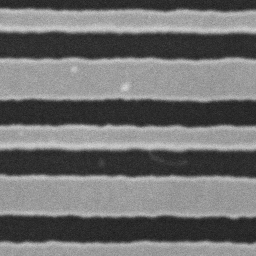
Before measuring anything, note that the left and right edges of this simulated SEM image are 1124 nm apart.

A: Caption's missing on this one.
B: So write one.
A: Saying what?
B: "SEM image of lines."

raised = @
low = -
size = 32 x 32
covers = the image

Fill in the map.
--------------------------------
@@@@@@@@@@@@@@@@@@@@@@@@@@@@@@@@
@@@@@@@@@@@@@@@@@@@@@@@@@@@@@@@@
@@@@@@@@@@@@@@@@@@@@@@@@@@@@@@@@
--------------------------------
--------------------------------
--------------------------------
@@@@-@@@@@@-@@@@@@@@@-@----@@@@@
@@@@@@@@@@@@@@@@@@@@@@@@@@@@@@@@
@@@@@@@@@@@@@@@@@@@@@@@@@@@@@@@@
@@@@@@@@@@@@@@@@@@@@@@@@@@@@@@@@
@@@@@@@@@@@@@@@@@@@@@@@@@@@@@@@@
--------------------@@@@@@@@----
--------------------------------
--------------------------------
--------------------------------
@@@@@@@@@@@@@@@@@@@@@@@@@@@@@@@@
@@@@@@@@@@@@@@@@@@@@@@@@@@@@@@@@
@@@@@@@@@@@@@@@@@@@@@@@@@@@@@@@@
--------------------------------
--------------------------------
--------------------------------
@@@@@@@@@@@@@@@@@@@@@@@@@@@@@@@@
@@@@@@@@@@@@@@@@@@@@@@@@@@@@@@@@
@@@@@@@@@@@@@@@@@@@@@@@@@@@@@@@@
@@@@@@@@@@@@@@@@@@@@@@@@@@@@@@@@
@@@@@@@@@@@@@@@@@@@@@@@@@@@@@@@@
--------------------------------
--------------------------------
--------------------------------
@@@@@@@@@@@@@@@@@@@@@@@@@@@@@@@@
@@@@@@@@@@@@@@@@@@@@@@@@@@@@@@@@